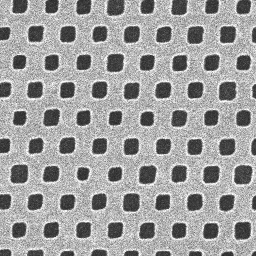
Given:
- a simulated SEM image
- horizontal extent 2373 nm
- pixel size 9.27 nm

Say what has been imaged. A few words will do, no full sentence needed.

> a regular array of holes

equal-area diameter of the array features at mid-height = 0.153 um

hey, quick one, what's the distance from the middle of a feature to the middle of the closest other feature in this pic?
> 31.7 px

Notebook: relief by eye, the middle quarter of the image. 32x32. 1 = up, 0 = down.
11100001111000011110001111100001
11110011111000011110011111100011
11111111111111111111111111111111
11111111111111111111111111111111
11111111001111111111111100111111
00011110000111100001111000011110
00011110000111100001111000011110
00011110000111100001111000011110
01111111001111100011111000111110
11111111111111111111111111111111
11111111111111111111111111111111
11111111111111111111111111110011
11100001111000011110001111100001
11100001111000011110001111100001
11100011111000111110001111100001
11111111111111111111111111100011
11111111111111111111111111111111
11111111111111111111111111111111
00111111111111111111111111111111
00011110000111100001111000011110
00011110000111100001111000011110
00111110000111100001111000111110
01111111001111100011111101111110
11111111111111111111111111111111
11111111111111111111111111111111
11111111111111111111001111110011
11100011111000111110000111100001
11100011111000111110000111100001
11100011111000111110000111100001
11111111111111111110001111110111
11111111111111111111111111111111
11111111111111111111111111111111